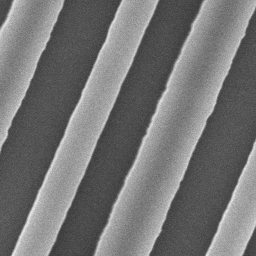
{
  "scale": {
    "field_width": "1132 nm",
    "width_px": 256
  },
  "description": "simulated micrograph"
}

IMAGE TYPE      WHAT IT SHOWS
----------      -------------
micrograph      lines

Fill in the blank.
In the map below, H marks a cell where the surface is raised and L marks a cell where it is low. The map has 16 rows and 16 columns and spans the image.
LHHHLLLHHHLLLHHH
HHHLLLLHHLLLHHHL
HHHLLLLHHLLLHHHL
HHHLLLHHLLLHHHHL
HHLLLLHHLLLHHHLL
HHLLLHHLLLHHHHLL
HLLLLHHLLLHHHLLL
HLLLHHHLLLHHHLLL
LLLLHHLLLHHHLLLL
LLLLHHLLLHHHLLLL
LLLHHLLLHHHHLLLH
LLLHHLLLHHHLLLLH
LLHHHLLHHHHLLLHH
LLHHLLLHHHLLLLHH
LHHHLLLHHHLLLLHH
LHHLLLHHHLLLLHHL